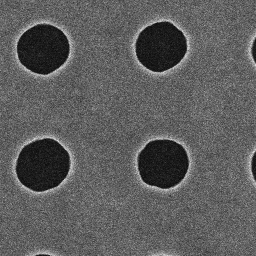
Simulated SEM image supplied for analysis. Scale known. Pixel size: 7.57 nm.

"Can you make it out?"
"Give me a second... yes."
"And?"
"holes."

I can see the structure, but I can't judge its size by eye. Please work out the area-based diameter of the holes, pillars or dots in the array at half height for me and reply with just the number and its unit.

385 nm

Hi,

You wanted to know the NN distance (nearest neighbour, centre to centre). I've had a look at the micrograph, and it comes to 882 nm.